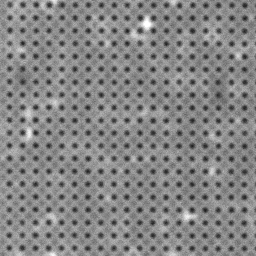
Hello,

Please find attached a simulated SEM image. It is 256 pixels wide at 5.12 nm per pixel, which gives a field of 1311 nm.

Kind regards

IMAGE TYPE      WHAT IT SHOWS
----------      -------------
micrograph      a regular array of holes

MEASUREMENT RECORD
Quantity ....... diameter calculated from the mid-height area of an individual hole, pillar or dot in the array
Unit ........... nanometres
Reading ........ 35.1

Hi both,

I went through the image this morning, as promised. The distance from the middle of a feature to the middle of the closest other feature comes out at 0.0646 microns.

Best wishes